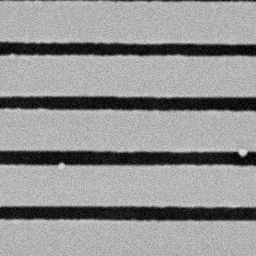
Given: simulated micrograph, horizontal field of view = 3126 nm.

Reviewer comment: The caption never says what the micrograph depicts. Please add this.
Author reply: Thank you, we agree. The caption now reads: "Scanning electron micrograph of lines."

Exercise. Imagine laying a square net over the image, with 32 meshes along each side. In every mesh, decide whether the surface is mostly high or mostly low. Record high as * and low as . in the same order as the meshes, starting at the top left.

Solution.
********************************
********************************
********************************
********************************
********************************
................................
................................
********************************
********************************
********************************
********************************
********************************
................................
................................
********************************
********************************
********************************
********************************
********************************
................................
................................
********************************
********************************
********************************
********************************
********************************
................................
................................
********************************
********************************
********************************
********************************